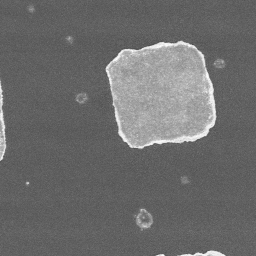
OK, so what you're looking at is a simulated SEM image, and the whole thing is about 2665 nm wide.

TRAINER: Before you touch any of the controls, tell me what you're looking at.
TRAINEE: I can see raised bodies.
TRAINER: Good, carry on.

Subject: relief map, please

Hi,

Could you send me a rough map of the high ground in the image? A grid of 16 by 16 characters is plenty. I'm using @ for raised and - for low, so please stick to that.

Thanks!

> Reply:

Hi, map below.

----------------
----------------
----------------
-------@@@@@@---
-------@@@@@@---
-------@@@@@@---
-------@@@@@@---
-------@@@@@@---
--------@@@@----
----------------
----------------
----------------
----------------
----------------
----------------
----------------